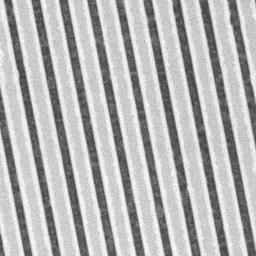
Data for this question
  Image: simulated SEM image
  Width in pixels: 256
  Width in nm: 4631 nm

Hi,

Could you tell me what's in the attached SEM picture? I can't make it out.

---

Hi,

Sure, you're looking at parallel lines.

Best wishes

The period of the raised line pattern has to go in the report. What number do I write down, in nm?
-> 497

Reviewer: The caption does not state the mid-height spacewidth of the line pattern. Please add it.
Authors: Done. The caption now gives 0.22 micrometres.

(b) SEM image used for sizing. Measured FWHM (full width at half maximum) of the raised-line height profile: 282 nm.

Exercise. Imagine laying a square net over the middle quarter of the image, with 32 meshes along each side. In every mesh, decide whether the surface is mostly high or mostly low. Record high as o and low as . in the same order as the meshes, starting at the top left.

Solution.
o....ooo....oooo...ooo....oooo..
oo...oooo...oooo...oooo...oooo..
oo...oooo...oooo...oooo...oooo..
oo...oooo...oooo...oooo...oooo..
oo...oooo...oooo...oooo...oooo..
oo....ooo....oooo..oooo....ooo..
ooo...oooo...oooo...oooo...oooo.
ooo...oooo...oooo...oooo...oooo.
ooo...oooo...oooo...oooo...oooo.
ooo...oooo...oooo...oooo...oooo.
ooo...oooo....ooo...oooo....ooo.
ooo....oooo...oooo...oooo...oooo
oooo...oooo...oooo...oooo...oooo
oooo...oooo...oooo...oooo...oooo
oooo...oooo...oooo...oooo...oooo
.ooo...oooo....ooo....ooo....ooo
.ooo....oooo...ooo....ooo....ooo
.oooo...oooo...oooo...oooo...ooo
.oooo...oooo...oooo...oooo...ooo
.oooo...oooo...oooo...oooo...ooo
..ooo...oooo....ooo...oooo...ooo
..ooo....ooo....oooo...ooo....oo
..oooo...oooo...oooo...oooo...oo
..oooo...oooo...oooo...oooo...oo
..oooo...oooo...oooo...oooo...oo
...ooo...oooo...oooo....ooo...oo
...ooo....ooo....oooo...ooo....o
...oooo...oooo...oooo...oooo...o
...oooo...oooo...oooo...oooo...o
...oooo...oooo...oooo...oooo...o
...oooo...oooo...oooo...oooo...o
....ooo....ooo....ooo....ooo...o